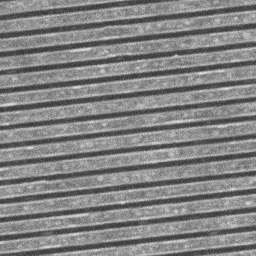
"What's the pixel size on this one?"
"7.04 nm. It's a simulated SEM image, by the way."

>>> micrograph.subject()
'parallel lines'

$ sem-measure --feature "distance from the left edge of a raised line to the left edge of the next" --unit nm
129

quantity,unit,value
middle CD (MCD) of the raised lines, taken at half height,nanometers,81.2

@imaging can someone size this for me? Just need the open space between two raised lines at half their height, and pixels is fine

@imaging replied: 6.7